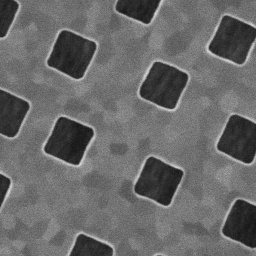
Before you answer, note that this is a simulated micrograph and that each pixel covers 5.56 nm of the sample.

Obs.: holes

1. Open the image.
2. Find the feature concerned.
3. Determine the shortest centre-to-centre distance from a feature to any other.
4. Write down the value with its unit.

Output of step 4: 507 nanometers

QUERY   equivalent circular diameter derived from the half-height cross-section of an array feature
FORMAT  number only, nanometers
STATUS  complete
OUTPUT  250